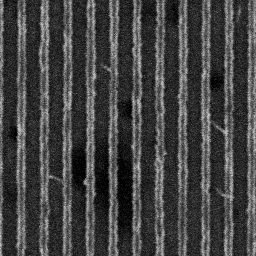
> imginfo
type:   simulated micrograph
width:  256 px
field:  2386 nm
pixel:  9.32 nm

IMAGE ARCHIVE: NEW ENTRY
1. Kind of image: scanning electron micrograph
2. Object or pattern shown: parallel lines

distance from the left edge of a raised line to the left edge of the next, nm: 215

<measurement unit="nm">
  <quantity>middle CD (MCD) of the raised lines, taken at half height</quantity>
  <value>65.3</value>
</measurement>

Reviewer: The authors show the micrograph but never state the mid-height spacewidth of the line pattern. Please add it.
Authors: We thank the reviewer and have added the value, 154 nanometers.